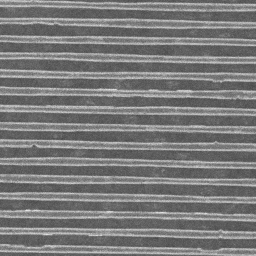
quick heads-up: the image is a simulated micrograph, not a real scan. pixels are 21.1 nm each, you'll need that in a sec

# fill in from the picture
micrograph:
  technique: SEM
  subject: parallel lines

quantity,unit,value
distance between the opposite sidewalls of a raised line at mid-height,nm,124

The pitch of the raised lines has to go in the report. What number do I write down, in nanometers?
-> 368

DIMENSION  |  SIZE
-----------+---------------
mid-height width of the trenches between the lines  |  247 nm